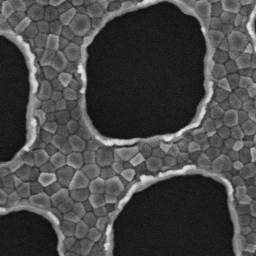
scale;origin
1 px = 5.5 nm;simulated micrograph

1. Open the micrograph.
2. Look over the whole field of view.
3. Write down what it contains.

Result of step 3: holes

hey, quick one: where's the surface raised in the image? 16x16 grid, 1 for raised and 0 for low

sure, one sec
1111111100011111
1111111000001111
0111110000000111
0011100000000111
0011100000000111
0011100000000111
0011100000000111
0011110000001111
0011110000111111
0111111111111111
1111111111111111
1111111110000011
1111111100000011
0001111000000011
0000111000000001
0000111000000001